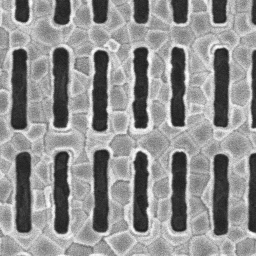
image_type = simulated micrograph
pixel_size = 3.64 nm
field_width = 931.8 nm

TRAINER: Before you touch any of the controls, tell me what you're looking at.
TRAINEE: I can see a regular array of holes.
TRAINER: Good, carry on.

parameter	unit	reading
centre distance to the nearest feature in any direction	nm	141